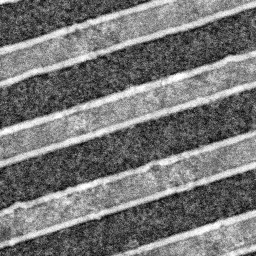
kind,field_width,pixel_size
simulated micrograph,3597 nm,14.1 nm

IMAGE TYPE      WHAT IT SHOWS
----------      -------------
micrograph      one or a few lines or trenches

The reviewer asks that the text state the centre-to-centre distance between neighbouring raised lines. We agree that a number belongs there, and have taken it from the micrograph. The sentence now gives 1080 nm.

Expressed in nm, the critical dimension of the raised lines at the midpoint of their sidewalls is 416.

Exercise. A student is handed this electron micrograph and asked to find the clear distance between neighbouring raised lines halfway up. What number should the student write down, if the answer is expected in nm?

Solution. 665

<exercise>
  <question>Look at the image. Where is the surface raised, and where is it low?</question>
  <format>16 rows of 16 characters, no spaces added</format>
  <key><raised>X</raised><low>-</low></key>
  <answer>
---------XXXXXX-
-----XXXXXXX----
--XXXXXXX-------
XXXXXX---------X
XX----------XXXX
---------XXXXXX-
------XXXXXX----
---XXXXXX-------
XXXXXX---------X
XX----------XXXX
---------XXXXXX-
------XXXXXX----
---XXXXXX-------
XXXXXX---------X
XXX---------XXXX
---------XXXXXXX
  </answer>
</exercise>